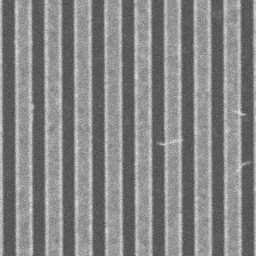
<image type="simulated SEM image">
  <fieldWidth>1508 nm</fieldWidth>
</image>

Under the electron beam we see parallel lines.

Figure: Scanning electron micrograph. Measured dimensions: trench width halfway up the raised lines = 87.6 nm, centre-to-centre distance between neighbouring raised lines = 0.176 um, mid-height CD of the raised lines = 87.6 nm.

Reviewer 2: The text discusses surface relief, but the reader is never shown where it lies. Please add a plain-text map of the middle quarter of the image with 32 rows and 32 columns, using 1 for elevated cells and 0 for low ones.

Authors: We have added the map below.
00011100001111000011100001111000
00011100001111000011100001111000
00011100001111000011100001111000
00011100001111000011100001111000
00011100001111000011100001111000
00011110001111000011100000111000
00011110001111000011100000111000
00011110001111000011100000111000
00011110001111000011110001111000
00011110001111000011110000111000
00011110001111000011100000111000
00011110001111000011100001111000
00011110000111000011100001111000
00011110000111000011100001111000
00011110000111000011100001111000
00011110000111000011100001111000
00011110000111000011100001111000
00011110000111000011100001111000
00011110000111000011100001111000
00011110000111000011110001111000
00011110000111000011100001111000
00011110000111000011100001111000
00011110000111000011100001111000
00011110000111000011100001111000
00011110000111000011100001111000
00011110000111000011100001111000
00011110000111000011100000111000
00011110000111000011100001111000
00011110000111000011110001111000
00011110000111000011110000111000
00011110000111000011110001111000
00011110000111000011110001111000